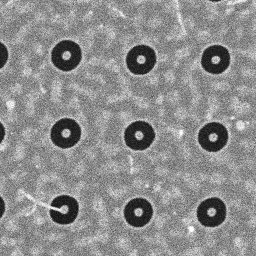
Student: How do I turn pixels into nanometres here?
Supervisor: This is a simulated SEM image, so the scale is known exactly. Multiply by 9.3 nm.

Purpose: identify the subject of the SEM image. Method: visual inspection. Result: a regular array of ring-shaped grooves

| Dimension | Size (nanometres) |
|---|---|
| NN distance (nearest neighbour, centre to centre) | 687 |